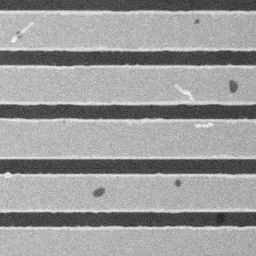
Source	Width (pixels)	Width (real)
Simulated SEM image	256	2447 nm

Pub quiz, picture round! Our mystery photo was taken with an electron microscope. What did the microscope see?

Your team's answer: lines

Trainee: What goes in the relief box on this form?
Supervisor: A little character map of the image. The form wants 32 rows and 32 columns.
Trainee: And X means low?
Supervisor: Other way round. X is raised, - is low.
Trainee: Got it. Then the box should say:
--------------------------------
XXXXXXXXXXXXXX--XXXXX-XXXXXXXXXX
XXXXXXXXXXXXXXXXXXXXXXXXXXXXXXXX
XXXXXXXXXXXXXXXXXXXXXXXXXXXXXXXX
XXXXXXXXXXXXXXXXXXXXXXXXXXXXXXXX
XXXXXXXXXXXXXXXXXXXXXXXXXXXXXXXX
--------------------------------
--------------------------------
XXXXXXXXXXXXXXXXXXXXXXXXXXXXXXXX
XXXXXXXXXXXXXXXXXXXXXXXXXXXXXXXX
XXXXXXXXXXXXXXXXXXXXXXXXXXXXXXXX
XXXXXXXXXXXXXXXXXXXXXXXXXXXXXXXX
XXXXXXXXXXXXXXXXXXXXXXXXXXXXXXXX
--------------------------------
--------------------------------
XXXXXXXXXXXXXXXXXXXXXXXXXXXXXXXX
XXXXXXXXXXXXXXXXXXXXXXXXXXXXXXXX
XXXXXXXXXXXXXXXXXXXXXXXXXXXXXXXX
XXXXXXXXXXXXXXXXXXXXXXXXXXXXXXXX
XXXXXXXXXXXXXXXXXXXXXXXXXXXXXXXX
--------------------------------
--------------------------------
XXXXXXXXXXXXXXXXXXXXXXXXXXXXXXXX
XXXXXXXXXXXXXXXXXXXXXXXXXXXXXXXX
XXXXXXXXXXXXXXXXXXXXXXXXXXXXXXXX
XXXXXXXXXXXXXXXXXXXXXXXXXXXXXXXX
-----------X--------XXX---------
--------------------------------
XXXXXXXXXXXXXXXXXXXXXXXXXXXXXXXX
XXXXXXXXXXXXXXXXXXXXXXXXXXXXXXXX
XXXXXXXXXXXXXXXXXXXXXXXXXXXXXXXX
XXXXXXXXXXXXXXXXXXXXXXXXXXXXXXXX